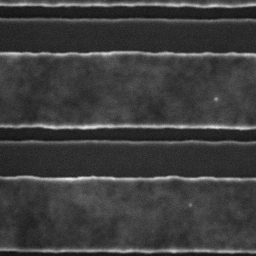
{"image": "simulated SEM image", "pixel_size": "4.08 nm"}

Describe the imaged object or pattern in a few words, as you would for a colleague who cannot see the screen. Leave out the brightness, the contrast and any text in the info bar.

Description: lines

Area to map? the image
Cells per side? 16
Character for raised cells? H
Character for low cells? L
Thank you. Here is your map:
LLLLLLLLLLLLLLLL
LLLLLLLLLLLLLLLL
LLLLLLLLLLLLLLLL
HHHHHHHHHHHHHHHH
HHHHHHHHHHHHHHHH
HHHHHHHHHHHHHHHH
HHHHHHHHHHHHHHHH
HHHHHHHHHHHHHHHH
LLLLLLLLLLLLLLLL
LLLLLLLLLLLLLLLL
LLLLLLLLLLLLLLLL
HHHHHHHHHHHHHHHH
HHHHHHHHHHHHHHHH
HHHHHHHHHHHHHHHH
HHHHHHHHHHHHHHHH
HHHHHHHHHHHHHHHH